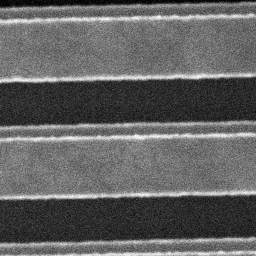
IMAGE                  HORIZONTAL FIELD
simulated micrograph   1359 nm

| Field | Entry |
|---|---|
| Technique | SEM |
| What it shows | lines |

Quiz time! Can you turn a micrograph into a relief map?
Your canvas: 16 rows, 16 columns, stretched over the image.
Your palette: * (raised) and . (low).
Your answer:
.***************
****************
****************
****************
****************
................
................
................
****************
****************
****************
****************
................
................
................
****************